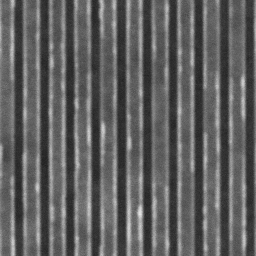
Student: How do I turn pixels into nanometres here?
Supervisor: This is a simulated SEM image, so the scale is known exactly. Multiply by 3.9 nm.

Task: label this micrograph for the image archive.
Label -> parallel lines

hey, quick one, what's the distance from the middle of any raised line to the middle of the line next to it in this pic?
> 100 nm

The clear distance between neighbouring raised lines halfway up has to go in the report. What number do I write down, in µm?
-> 0.0395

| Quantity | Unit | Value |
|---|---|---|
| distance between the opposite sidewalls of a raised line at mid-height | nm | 61.4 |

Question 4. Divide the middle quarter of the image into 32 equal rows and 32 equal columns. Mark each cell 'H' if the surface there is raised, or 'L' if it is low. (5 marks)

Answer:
LLLHHHLLLHHHHLLLHHHLLLHHHHLLLHHH
LLLHHHLLLHHHHLLLHHHLLLHHHHLLLHHH
LLLHHHHLLHHHHLLLHHHLLLHHHHLLLHHH
LLLHHHHLLHHHHLLLHHHLLLHHHHLLLHHH
LLLHHHHLLHHHHLLLHHHLLLHHHHLLLHHH
LLLHHHHLLHHHHLLLHHHLLLHHHHLLLHHH
LLLHHHHLLHHHHLLLHHHLLLHHHHLLLHHH
LLLHHHHLLHHHHLLLHHHLLLHHHHLLLHHH
LLLHHHHLLHHHHLLLHHHLLLHHHHLLLHHH
LLLHHHHLLHHHHLLLHHHLLLHHHHLLLHHH
LLLHHHHLLHHHHLLLHHHLLLHHHHLLLHHH
LLLHHHLLLHHHHLLLHHHLLLHHHHLLLHHH
LLLHHHLLLHHHHLLLHHHLLLHHHHLLLHHH
LLLHHHLLLHHHHLLLHHHLLLHHHHLLLHHH
LLLHHHLLLHHHHLLLHHHLLLHHHHLLLHHH
LLLHHHLLLHHHHLLLHHHLLLHHHHLLLHHH
LLLHHHLLLHHHHLLLHHHLLLHHHHLLLHHH
LLLHHHLLLHHHHLLLHHHLLLHHHHLLLHHH
LLLHHHLLLHHHHLLLHHHLLLHHHHLLLHHH
LLLHHHLLLHHHHLLLHHHLLLHHHHLLLHHH
LLLHHHLLLHHHHLLLHHHLLLHHHHLLLHHH
LLLHHHHLLHHHHLLLHHHLLLHHHHLLLHHH
LLLHHHHLLHHHHLLLHHHLLLHHHHLLLHHH
LLLHHHHLLHHHHLLLHHHLLLHHHHLLLHHH
LLLHHHHLLHHHHLLLHHHLLLHHHHLLLHHH
LLLHHHHLLHHHHLLLHHHLLLHHHHLLLHHH
LLLHHHHLLHHHHLLLHHHLLLHHHHLLLHHH
LLLHHHLLLHHHHLLLHHHLLLHHHHLLLHHH
LLLHHHLLLHHHHLLLHHHLLLHHHHLLLHHH
LLLHHHLLLHHHHLLLHHHLLLHHHHLLLHHH
LLLHHHLLLHHHHLLLHHHLLLHHHHLLLHHH
LLLHHHLLLHHHHLLLHHHLLLHHHHLLLHHH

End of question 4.